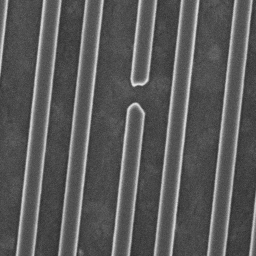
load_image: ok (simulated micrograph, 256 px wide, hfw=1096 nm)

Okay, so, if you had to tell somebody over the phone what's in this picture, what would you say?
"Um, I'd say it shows parallel lines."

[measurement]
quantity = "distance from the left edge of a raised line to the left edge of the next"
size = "203 nanometers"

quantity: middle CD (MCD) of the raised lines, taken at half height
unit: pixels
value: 17.5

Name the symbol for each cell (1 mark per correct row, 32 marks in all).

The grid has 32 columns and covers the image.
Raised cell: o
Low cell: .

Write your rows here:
o....ooo...oo....ooo...oo....oo.
o....ooo...oo....oo....oo....oo.
o....oo....oo....oo...ooo....oo.
o....oo...oo.....oo...oo.....oo.
.....oo...oo.....oo...oo.....oo.
.....oo...oo.....oo...oo.....oo.
.....oo...oo.....oo...oo.....oo.
.....oo...oo.....oo...oo.....oo.
.....oo...oo.....oo...oo....ooo.
....ooo...oo....ooo...oo....oo..
....ooo...oo.....o....oo....oo..
....oo....oo.........ooo....oo..
....oo...ooo.........ooo....oo..
....oo...oo.....oo...oo.....oo..
....oo...oo.....oo...oo.....oo..
....oo...oo.....oo...oo.....oo..
....oo...oo.....oo...oo.....oo..
....oo...oo.....oo...oo.....oo..
....oo...oo....ooo...oo....oo...
...oo....oo....oo....oo....oo...
...oo....oo....oo...ooo....oo...
...oo...ooo....oo...ooo....oo...
...oo...oo.....oo...oo.....oo...
...oo...oo.....oo...oo.....oo...
...oo...oo.....oo...oo.....oo...
...oo...oo.....oo...oo.....oo...
...oo...oo.....oo...oo.....oo...
...oo...oo....ooo...oo....ooo...
..ooo...oo....ooo...oo....oo....
..ooo...oo....oo....oo....oo...o
..oo....oo....oo...ooo....oo...o
..oo...oo.....oo...oo.....oo...o